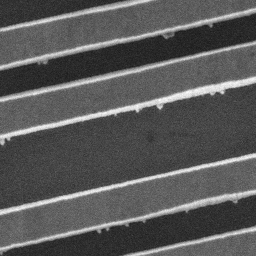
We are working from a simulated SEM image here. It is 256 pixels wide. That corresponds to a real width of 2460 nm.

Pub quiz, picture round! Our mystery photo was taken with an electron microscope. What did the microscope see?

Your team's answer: lines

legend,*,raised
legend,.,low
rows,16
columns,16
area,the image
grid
......**********
..***********...
********........
****........****
........********
...***********..
*********.......
*****...........
*...............
................
............****
........********
...***********..
**********......
*****..........*
*.........******